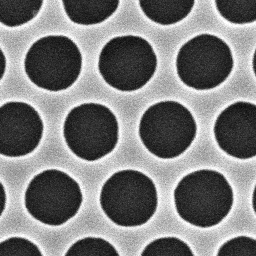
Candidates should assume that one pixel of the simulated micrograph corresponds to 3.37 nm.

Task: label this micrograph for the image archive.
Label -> a regular array of holes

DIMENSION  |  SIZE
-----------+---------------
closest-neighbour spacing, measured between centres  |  254 nm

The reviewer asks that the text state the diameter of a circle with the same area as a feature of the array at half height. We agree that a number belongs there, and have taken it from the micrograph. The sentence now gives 193 nanometres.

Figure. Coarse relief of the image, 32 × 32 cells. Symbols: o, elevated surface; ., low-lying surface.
.....ooo.......oo.......ooo.....
.....ooo......oooo......ooo.....
....ooooo....oooooo....ooooo....
oooooooooooooooooooooooooooooooo
oooooo..ooooooo..oooooooo..ooooo
oooo.....oooo......oooo.....oooo
ooo.......ooo......ooo.......ooo
.oo.......oo........oo.......ooo
.oo.......oo........oo.......ooo
ooo.......ooo......ooo.......ooo
oooo.....oooo.....ooooo.....oooo
oooooooooooooooooooooooooooooooo
oooooooooooooooooooooooooooooooo
....ooooo....oooooo....ooooo....
.....ooo......oooo......ooo.....
.....ooo.......oo........oo.....
.....ooo.......oo........oo.....
.....ooo.......ooo......ooo.....
.....oooo.....oooo.....oooo.....
o..ooooooo...ooooooo..ooooooo...
oooooooooooooooooooooooooooooooo
ooooo...oooooo....oooooo...ooooo
oooo.....oooo......oooo.....oooo
.oo.......ooo.......oo.......ooo
.oo.......ooo.......oo.......ooo
.oo.......ooo.......oo.......ooo
ooo.......ooo......ooo.......ooo
ooooo....ooooo.....oooo.....oooo
ooooooooooooooooooooooooo.oooooo
oooooooooooooooooooooooooooooo.o
....ooooo.....ooooo....ooooo....
.....ooo.......ooo......ooo.....